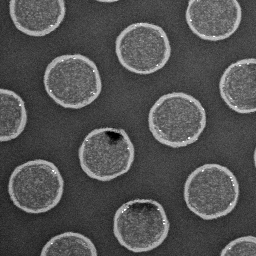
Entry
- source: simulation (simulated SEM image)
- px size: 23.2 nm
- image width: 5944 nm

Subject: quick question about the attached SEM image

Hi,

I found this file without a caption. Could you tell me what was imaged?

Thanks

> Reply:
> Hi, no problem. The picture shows raised bodies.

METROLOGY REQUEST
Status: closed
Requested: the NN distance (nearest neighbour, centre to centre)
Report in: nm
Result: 1810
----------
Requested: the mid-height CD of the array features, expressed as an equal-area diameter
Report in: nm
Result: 1170